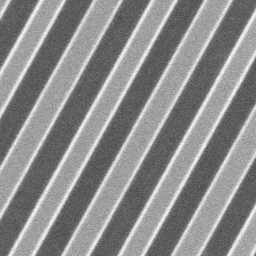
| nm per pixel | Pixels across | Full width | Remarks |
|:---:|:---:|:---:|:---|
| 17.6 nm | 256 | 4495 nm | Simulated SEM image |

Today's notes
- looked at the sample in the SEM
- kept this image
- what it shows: lines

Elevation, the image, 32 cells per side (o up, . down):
o....ooo...oooo....ooo...oooo...
....ooo....ooo....ooo....ooo....
....ooo...oooo....ooo...oooo...o
...ooo....ooo....ooo....ooo....o
..oooo...oooo...oooo...oooo...oo
..ooo....ooo....ooo....ooo....oo
.oooo...oooo...oooo...ooo....ooo
.ooo....ooo....ooo...oooo...oooo
ooo....oooo...ooo....ooo....ooo.
ooo...oooo....ooo...oooo...oooo.
oo....ooo....ooo....ooo....ooo..
oo...oooo...oooo...oooo...ooo...
o....ooo....ooo....ooo....ooo...
o...oooo...oooo...oooo...ooo....
....ooo....ooo...oooo....ooo...o
...oooo...oooo...ooo....ooo....o
..oooo....ooo...oooo...oooo...oo
..oooo...ooo....ooo....ooo....oo
.oooo....ooo...oooo...oooo...ooo
.ooo....ooo....ooo....ooo...oooo
oooo...oooo...oooo...ooo....ooo.
ooo....ooo....ooo....ooo...oooo.
ooo...oooo...ooo....ooo....ooo..
oo....ooo...oooo...oooo...oooo..
oo...ooo....ooo....ooo....ooo...
o....ooo...oooo...oooo...oooo...
....ooo....ooo....ooo...oooo...o
....ooo...oooo...oooo...ooo....o
...ooo....ooo....ooo...oooo...oo
..oooo...oooo...ooo....ooo....oo
..ooo....ooo....ooo...oooo...ooo
.oooo...ooo....ooo....ooo....ooo